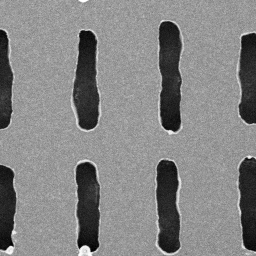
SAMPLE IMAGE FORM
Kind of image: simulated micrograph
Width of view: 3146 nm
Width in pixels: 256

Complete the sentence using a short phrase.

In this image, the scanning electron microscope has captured holes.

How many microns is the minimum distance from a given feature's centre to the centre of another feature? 1.01